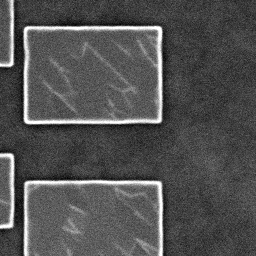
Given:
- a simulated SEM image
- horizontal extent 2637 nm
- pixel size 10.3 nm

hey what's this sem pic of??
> wiring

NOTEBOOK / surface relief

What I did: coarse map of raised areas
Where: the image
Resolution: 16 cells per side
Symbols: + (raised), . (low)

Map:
+...............
+...............
+.++++++++......
+.++++++++......
..++++++++......
..++++++++......
..++++++++......
..++++++++......
................
................
+...............
+.++++++++......
+.++++++++......
+.++++++++......
..++++++++......
..++++++++......